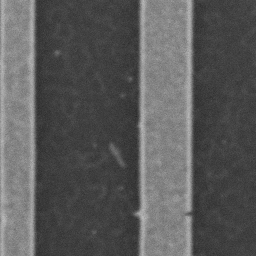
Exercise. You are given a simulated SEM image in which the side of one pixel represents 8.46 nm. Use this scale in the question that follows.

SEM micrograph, one or a few lines or trenches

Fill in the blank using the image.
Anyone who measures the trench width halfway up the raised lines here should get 111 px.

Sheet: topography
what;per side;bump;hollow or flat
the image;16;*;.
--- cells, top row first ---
**.......***....
**.......***....
**.......***....
**.......***....
**.......***....
**.......***....
**.......***....
**.......***....
**.......***....
**.......***....
**.......***....
**.......***....
**.......***....
**.......***....
**.......***....
**.......***....